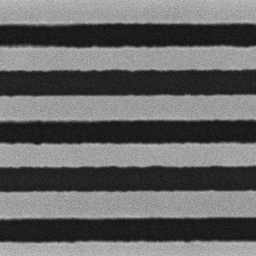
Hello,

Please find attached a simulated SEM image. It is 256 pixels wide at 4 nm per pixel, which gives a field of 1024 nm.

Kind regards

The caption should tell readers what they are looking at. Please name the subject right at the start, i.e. lines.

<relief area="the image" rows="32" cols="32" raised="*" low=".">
********************************
********************************
********************************
................................
................................
................................
********************************
********************************
********************************
................................
................................
................................
********************************
********************************
********************************
................................
................................
................................
********************************
********************************
********************************
................................
................................
................................
********************************
********************************
********************************
................................
................................
................................
********************************
********************************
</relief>